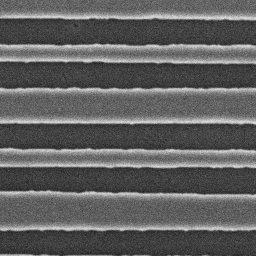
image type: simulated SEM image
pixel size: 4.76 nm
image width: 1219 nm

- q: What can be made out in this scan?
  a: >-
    lines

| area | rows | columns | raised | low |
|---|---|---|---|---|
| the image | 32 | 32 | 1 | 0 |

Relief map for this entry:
11111111111111111111111111111111
11111111111111111111111111111111
00000000000000000000000000000000
00000000000000000000000000000000
00000000000000000000000000000000
00000000000000000000000000000000
11111111111111111111111111111111
11111111111111111111111111111111
00000000000000000000000000000000
00000000000000000000000000000000
00000000000000000000000000000000
11111111111111111111111111111111
11111111111111111111111111111111
11111111111111111111111111111111
11111111111111111111111111111111
00000000000000000000000000000001
00000000000000000000000000000000
00000000000000000000000000000000
00000000000000000000000000000000
11111111111111111111111111111111
11111111111111111111111111111111
00000000000000000000000000000000
00000000000000000000000000000000
00000000000000000000000000000000
11111111111111111111111111111111
11111111111111111111111111111111
11111111111111111111111111111111
11111111111111111111111111111111
11111111111111111111111111111111
00000000000000000000000000000000
00000000000000000000000000000000
00000000000000000000000000000000